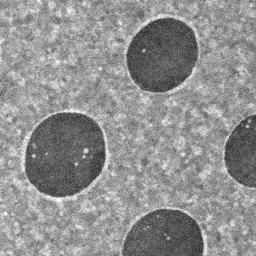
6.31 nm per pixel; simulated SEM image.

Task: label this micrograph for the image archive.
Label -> holes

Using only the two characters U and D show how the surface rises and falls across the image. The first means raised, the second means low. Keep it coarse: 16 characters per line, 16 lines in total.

UUUUUUUUUUUUUUUU
UUUUUUUUUDDDUUUU
UUUUUUUUDDDDUUUU
UUUUUUUUDDDDUUUU
UUUUUUUUDDDDUUUU
UUUUUUUUUDDUUUUU
UUUUUUUUUUUUUUUU
UUUDDDUUUUUUUUUD
UUDDDDDUUUUUUUDD
UUDDDDDUUUUUUUDD
UDDDDDUUUUUUUUDD
UUDDDDUUUUUUUUUD
UUUUUUUUUUUUUUUU
UUUUUUUUUDDDUUUU
UUUUUUUUDDDDDUUU
UUUUUUUUDDDDDUUU